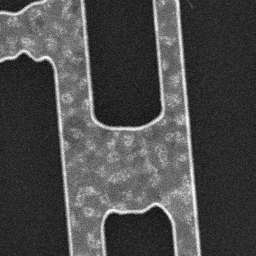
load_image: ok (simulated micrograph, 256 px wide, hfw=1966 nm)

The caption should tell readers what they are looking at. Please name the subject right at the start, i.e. one or a few lines or trenches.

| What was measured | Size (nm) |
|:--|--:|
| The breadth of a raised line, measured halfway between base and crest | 191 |